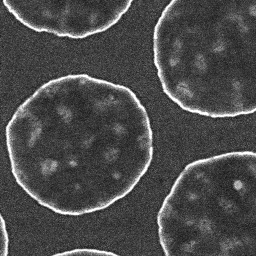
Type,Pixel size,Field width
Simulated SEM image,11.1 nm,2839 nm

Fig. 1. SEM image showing raised bodies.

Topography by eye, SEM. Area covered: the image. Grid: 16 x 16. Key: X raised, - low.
-XXXXXXX--XXXXXX
--XXXXX---XXXXXX
----------XXXXXX
----------XXXXXX
----------XXXXXX
---XXXXX--XXXXXX
-XXXXXXXX--XXXXX
-XXXXXXXX-------
XXXXXXXXX-------
-XXXXXXXX-------
-XXXXXXXX---XXXX
-XXXXXXX---XXXXX
--XXXXX---XXXXXX
----------XXXXXX
----------XXXXXX
----------XXXXXX